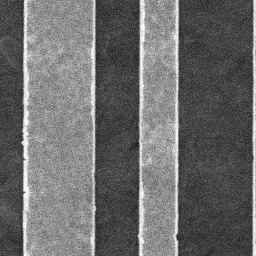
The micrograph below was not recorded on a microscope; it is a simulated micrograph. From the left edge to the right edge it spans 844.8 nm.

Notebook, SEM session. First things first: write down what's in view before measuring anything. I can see one or a few lines or trenches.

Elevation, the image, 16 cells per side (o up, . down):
..oooo...oo.....
..oooo...oo.....
..oooo...oo.....
..oooo...oo.....
..oooo...oo.....
..oooo...oo.....
..oooo...oo.....
..oooo...oo.....
..oooo...oo.....
..oooo...oo.....
..oooo...oo.....
..oooo...oo.....
..oooo...oo.....
.ooooo...oo.....
..oooo...oo.....
..oooo...oo.....